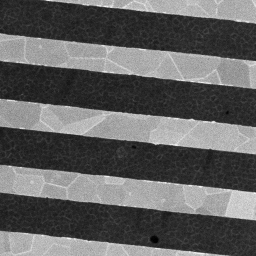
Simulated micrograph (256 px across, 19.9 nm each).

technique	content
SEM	one or a few lines or trenches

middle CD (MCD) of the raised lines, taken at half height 27.2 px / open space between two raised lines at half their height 38.3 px